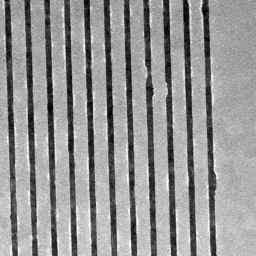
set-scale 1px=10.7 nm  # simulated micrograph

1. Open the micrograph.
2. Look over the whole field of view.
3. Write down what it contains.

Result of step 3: parallel lines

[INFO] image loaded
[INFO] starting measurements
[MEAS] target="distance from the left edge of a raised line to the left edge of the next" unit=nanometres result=213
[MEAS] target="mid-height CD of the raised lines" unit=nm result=144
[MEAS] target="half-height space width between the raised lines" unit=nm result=69.7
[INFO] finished